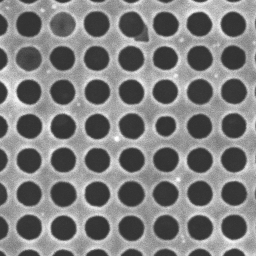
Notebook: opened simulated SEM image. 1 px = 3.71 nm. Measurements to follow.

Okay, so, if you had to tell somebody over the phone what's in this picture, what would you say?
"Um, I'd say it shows a regular array of holes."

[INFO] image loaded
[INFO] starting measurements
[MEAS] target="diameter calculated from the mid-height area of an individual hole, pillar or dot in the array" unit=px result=25.4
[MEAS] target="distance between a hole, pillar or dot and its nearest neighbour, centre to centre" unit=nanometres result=124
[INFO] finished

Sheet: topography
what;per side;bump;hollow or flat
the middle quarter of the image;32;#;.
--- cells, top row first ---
..####.....###.....####.....####
.######..######...#######.######
################################
################################
.#####....#####....####....#####
..###......###......##......###.
...##......##.......##......###.
...##......###......##......###.
..###......###......##......###.
..#####...#####....#####...#####
################################
################################
#######..#######..##############
..####.....###.....#####...####.
...##......###......###.....###.
...##......###......###.....###.
...##......###......###.....###.
..####.....###.....#####...####.
.######...######..##############
################################
################################
..####....#####....#####....####
...###.....###......###......##.
...##.......##......##.......##.
...##.......##......##.......##.
...###.....###......###.....###.
..#####....####....#####...#####
################################
################################
#######...######..######...#####
..####.....###.....####.....###.
...##......###......##.......##.